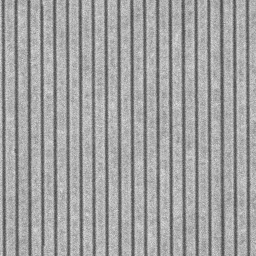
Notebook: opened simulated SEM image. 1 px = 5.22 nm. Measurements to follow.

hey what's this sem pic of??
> parallel lines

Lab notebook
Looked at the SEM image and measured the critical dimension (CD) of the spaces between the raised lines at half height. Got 0.0202 µm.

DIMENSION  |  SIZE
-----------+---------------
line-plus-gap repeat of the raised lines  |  12.9 pixels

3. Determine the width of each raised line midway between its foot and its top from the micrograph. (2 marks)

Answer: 0.045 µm